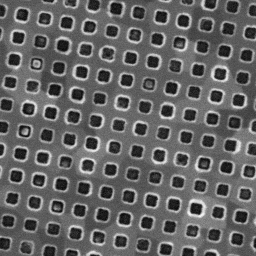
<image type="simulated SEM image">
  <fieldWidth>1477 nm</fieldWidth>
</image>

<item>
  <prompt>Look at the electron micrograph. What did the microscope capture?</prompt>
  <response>a regular array of holes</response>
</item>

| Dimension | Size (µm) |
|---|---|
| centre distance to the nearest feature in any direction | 0.131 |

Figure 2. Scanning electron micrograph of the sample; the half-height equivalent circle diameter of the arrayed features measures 13.5 pixels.